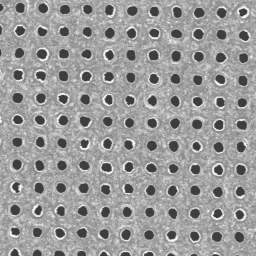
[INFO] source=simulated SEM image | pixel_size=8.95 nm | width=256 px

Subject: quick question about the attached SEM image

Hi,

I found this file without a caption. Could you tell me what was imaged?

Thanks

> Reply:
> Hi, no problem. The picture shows a regular array of holes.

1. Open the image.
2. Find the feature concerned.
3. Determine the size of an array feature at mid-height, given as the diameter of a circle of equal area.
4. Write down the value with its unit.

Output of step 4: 86.3 nanometers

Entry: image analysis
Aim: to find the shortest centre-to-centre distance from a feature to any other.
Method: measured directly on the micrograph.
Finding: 195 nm